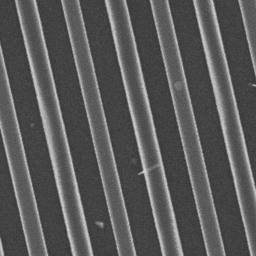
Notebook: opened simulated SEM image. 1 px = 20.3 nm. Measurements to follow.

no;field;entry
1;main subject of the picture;lines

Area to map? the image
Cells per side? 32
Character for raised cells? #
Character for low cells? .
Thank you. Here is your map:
..###...##...###...##...###...##
..###...##....##...##...###...##
..###...##....##...##....##...##
...##...###...##....##...##....#
...##....##...###...##...###...#
...###...##...###...##...###...#
...###...##....##...##....##...#
....##...###...##...###...##....
#...##....##...###...##...##....
#...###...##...###...##...###...
#...###...##....##...##....##...
#....##...##....##...###...##...
##...##...###...###...##...##...
##...##....##...###...##...###..
##...###...##...###...##....##..
##...###...##....##...##....##..
###...##...###...##....##...##..
###...##....##...###...##...###.
.##...###...##...###...##...###.
.##...###...##....##...##....##.
.##....##...##....##...###...##.
.###...##...###...###...##...##.
..##...###...##...###...##...###
..##...###...##...###...##....##
..##...###...##....##...##....##
..###...##...###...##...###...##
..###...##....##...###...##...##
...##...###...##...###...##...##
...##...###...##....##...##....#
...##....##...##....##...###...#
...###...##....##...###...##...#
....##...###...##...###...##...#